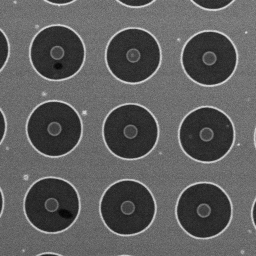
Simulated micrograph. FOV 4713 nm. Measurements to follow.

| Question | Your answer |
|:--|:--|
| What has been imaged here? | an array of small figures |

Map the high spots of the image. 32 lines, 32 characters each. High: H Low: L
HHHHHHHLHHHHHHHLLLLHHHHHHLLLLHHH
HHHHHHHHHHHHHHHHHHHHHHHHHHHHHHHH
HHHHHHHHHHHHHHHHHHHHHHHHHHHHHHHH
HHHHHHLLLHHHHHHHHHHHHHHHHHHHHHHH
LHHHHLLLLLHHHHLLLLLHHHHHLLLLHHHH
LHHHLLLLLLHHHHLLLLLLHHHLLLLLLHHH
LHHHLLHHLLLHHLLLHLLLHHHLLLLLLLHH
LHHHLLLLLLHHHLLLHLLLHHHLLHHLLLHH
HHHHLLLLLLHHHHLLLLLLHHHLLLLLLHHH
HHHHHLLLLHHHHHLLLLLHHHHHLLLLLHHH
HHHHHHHHHHHHHHHHHHHHHHHHHLLHHHHH
HHHHHHHHHHHHHHHHHHHHHHHHHHHHHHHH
HHHHHHHHHHHHHHHHHHHHHHHHHHHHHHHH
HHHHHLLLLHHHHHHLLLHHHHHHHLLHHHHH
HHHHLLLLLLHHHHLLLLLHHHHLLLLLHHHH
LHHLLLHLLLHHHLLLLLLLHHHLLLLLLHHH
LHHLLLHLLLHHHLLLHLLLHHLLLHLLLHHH
HHHHLLLLLLHHHLLLLLLLHHLLLLLLLHHH
HHHHLLLLLHHHHHLLLLLHHHHLLLLLLHHH
HHHHHHLLHHHHHHHLLLHHHHHHLLLLHHHH
HHHHHHHHHHHHHHHHHHHHHHHHHHHHHHHH
HHHHHHHHHHHHHHHHHHHHHHHHHHHHHHHH
HHHHHLLLHHHHHHHHHHHHHHHHHHHHHHHH
HHHHLLLLLHHHHHLLLLHHHHHLLLLLHHHH
HHHLLLLLLLHHHLLLLLLHHHHLLLLLHHHH
HHHLLLHLLLHHHLLHHLLHHHLLLLLLLHHH
HHHLLLLLLLHHHLLLHLLHHHLLLHLLLHHL
HHHHLLLLLHHHHLLLLLLHHHLLLLLLLHHH
HHHHHLLLHHHHHHLLLLHHHHHLLLLLHHHH
HHHHHHHHHHHHHHHHHHHHHHHHLLLHHHHH
HHHHHHHHHHHHHHHHHHHHHHHHHHHHHHHH
HHHHHHHHHHHHHHHHHHHHHHHHHHHHHHHH